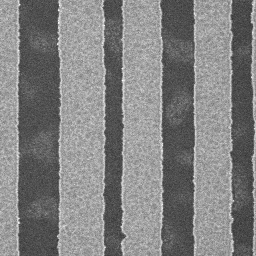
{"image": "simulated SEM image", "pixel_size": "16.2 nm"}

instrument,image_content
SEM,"one or a few lines or trenches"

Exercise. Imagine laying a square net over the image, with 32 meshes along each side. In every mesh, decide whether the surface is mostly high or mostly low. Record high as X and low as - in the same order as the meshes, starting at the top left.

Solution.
XX-----XXXXXX--XXXXX----XXXXX---
XX-----XXXXXX--XXXXX----XXXXX---
XX-----XXXXXX---XXXX----XXXXX---
XX-----XXXXXX---XXXX----XXXXX---
XX-----XXXXXX--XXXXX----XXXXX---
XX-----XXXXXX--XXXXX----XXXXX---
XX-----XXXXXX--XXXXX----XXXXX---
XX------XXXXX--XXXXX----XXXXX---
XX------XXXXX--XXXXX----XXXXX---
XX------XXXXX---XXXX----XXXXX---
XX------XXXXX--XXXXX----XXXXX---
XX------XXXXX---XXXX----XXXXX---
XX------XXXXX--XXXXX----XXXXX---
XX------XXXXX--XXXXX----XXXXX---
XX------XXXXX---XXXX----XXXXX---
XX------XXXXX---XXXX----XXXXX---
XX------XXXXX---XXXX----XXXXX---
XX-----XXXXXX--XXXXX----XXXXX---
XX-----XXXXXX--XXXXX----XXXXX---
XX------XXXXX--XXXXX----XXXXX---
XX------XXXXX---XXXX----XXXXX---
XX------XXXXX--XXXXX----XXXXX---
XX------XXXXX--XXXXX----XXXXX---
XX------XXXXX--XXXXX----XXXXX---
XX------XXXXX--XXXXX----XXXXX---
XX------XXXXX--XXXXX----XXXXX---
XX-----XXXXXX--XXXXX----XXXXX---
XX------XXXXX--XXXXX----XXXXX---
XX-----XXXXXX--XXXXX----XXXXX---
XX-----XXXXXX---XXXX----XXXXX---
XX-----XXXXXX--XXXXX----XXXXX---
XX-----XXXXXX--XXXXX----XXXXX---